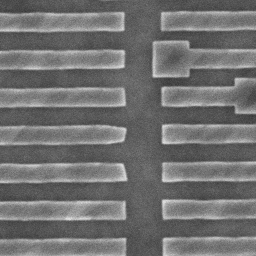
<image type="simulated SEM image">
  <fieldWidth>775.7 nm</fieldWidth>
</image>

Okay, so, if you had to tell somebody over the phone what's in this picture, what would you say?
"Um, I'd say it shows wiring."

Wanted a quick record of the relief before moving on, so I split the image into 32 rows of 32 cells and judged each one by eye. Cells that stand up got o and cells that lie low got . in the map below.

................................
.....................ooooooooooo
ooooooooooooooo.....oooooooooooo
ooooooooooooooo.....oooooooooooo
................................
...................ooooo........
ooooooooooooooo....ooooooooooooo
ooooooooooooooo....ooooooooooooo
ooooooooooooooo....ooooooooooo..
...................oooo.........
.............................ooo
oooooooooooooooo....oooooooooooo
oooooooooooooooo....oooooooooooo
.............................ooo
................................
................................
oooooooooooooooo....oooooooooooo
ooooooooooooooo.....oooooooooooo
................................
................................
.........ooooo.......ooooooooooo
oooooooooooooooo....oooooooooooo
ooooooooooooooo.....oooooooooooo
................................
................................
ooooooooooooooo.....oooooooooooo
oooooooooooooooo....oooooooooooo
..oo............................
................................
................................
oooooooooooooooo....oooooooooooo
oooooooooooooooo....oooooooooooo